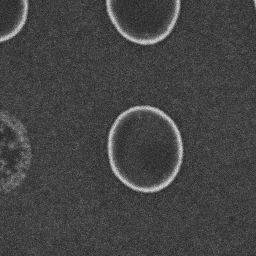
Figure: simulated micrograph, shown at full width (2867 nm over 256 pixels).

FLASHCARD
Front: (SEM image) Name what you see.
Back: raised bodies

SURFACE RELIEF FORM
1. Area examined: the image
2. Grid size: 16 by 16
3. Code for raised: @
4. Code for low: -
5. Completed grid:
@@-----@@@@-----
@------@@@@-----
--------@@------
----------------
----------------
----------------
----------------
-------@@@@-----
-------@@@@-----
-------@@@@-----
-------@@@@-----
--------@@------
----------------
----------------
----------------
----------------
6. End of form